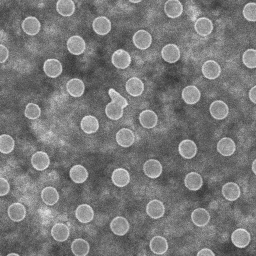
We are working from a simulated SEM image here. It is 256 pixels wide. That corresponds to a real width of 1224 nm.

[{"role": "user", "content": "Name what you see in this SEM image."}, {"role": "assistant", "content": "a regular array of raised bodies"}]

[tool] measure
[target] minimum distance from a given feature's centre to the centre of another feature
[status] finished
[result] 158 nm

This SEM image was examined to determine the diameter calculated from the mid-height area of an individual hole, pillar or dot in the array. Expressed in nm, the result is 85.3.